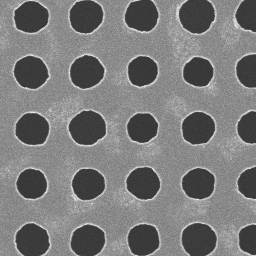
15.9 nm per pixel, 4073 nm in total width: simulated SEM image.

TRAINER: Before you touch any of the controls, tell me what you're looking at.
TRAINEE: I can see a regular array of holes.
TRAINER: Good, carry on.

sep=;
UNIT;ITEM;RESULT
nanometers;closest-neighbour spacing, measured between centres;878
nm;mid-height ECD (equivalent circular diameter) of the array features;524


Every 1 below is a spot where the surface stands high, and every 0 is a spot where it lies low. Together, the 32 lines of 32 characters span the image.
11100111100011110001111000111100
11000011100001110000110000011100
11000011100001110000110000011100
11000111100011111001111000111100
11111111111111111111111111111111
11111111111111111111111111111111
11111111111111111111111111111111
11000111110011111001111100111100
11000011100001110000111000011100
11000011100001110000111000011100
11000111100011111001111100111100
11111111111111111111111111111111
11111111111111111111111111111111
11111111111111111111111111111111
11100111100001111001111100111100
11000011100001110000111000011100
11000011100001110000111000011100
11100011100011111001111000111100
11111111111111111111111111111111
11111111111111111111111111111111
11111111111111111111111111111111
11100111110011110001111100111100
11000011100001110000111000011100
11000011100001110000111000011100
11100111110011111001111100111110
11111111111111111111111111111111
11111111111111111111111111111111
11111111111111111111111111111111
11100111110011111001111000111100
11000011100001110000111000011100
11000011100001110000111000011100
11000011100011111001111000111110